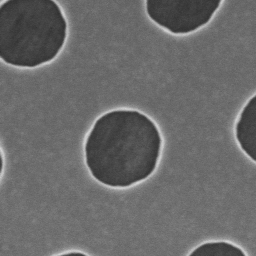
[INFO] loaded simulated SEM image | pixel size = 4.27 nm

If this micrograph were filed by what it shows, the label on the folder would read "holes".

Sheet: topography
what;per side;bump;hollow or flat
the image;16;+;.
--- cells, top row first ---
....+++++.....++
....++++++...+++
....++++++++++++
...+++++++++++++
++++++++++++++++
++++++++++++++++
+++++++++++++++.
++++++...++++++.
++++++....+++++.
+++++.....+++++.
++++++....++++++
+++++++.++++++++
++++++++++++++++
++++++++++++++++
++++++++++++++++
++++++++++++...+